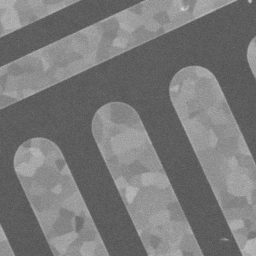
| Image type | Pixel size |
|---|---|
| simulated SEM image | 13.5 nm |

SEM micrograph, groups of lines, slits or small figures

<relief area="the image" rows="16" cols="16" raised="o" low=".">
oooo....oooooo..
oo....oooooo....
....ooooo.......
..ooooo........o
ooooo......oo...
ooo........ooo..
o......o...ooo..
......ooo..oooo.
......ooo...ooo.
.ooo..oooo..oooo
.ooo...ooo...ooo
.oooo..oooo..ooo
..ooo...ooo...oo
..oooo..oooo..oo
...ooo...ooo..oo
o..oooo..ooo...o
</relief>